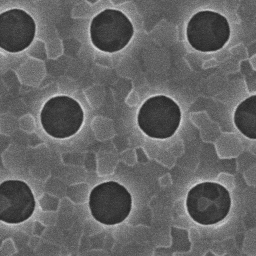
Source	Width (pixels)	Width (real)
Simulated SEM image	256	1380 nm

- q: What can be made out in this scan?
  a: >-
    holes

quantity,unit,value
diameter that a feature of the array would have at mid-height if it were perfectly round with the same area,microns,0.234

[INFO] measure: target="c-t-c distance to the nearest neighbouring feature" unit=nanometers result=524